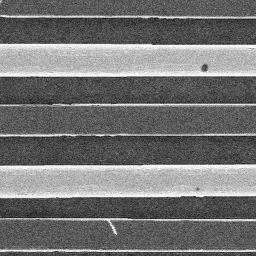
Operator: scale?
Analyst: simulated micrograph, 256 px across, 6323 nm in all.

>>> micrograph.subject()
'lines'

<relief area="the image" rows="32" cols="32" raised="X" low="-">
XXXXXXXXXXXXXXXXXXXXXXXXXXXXXXXX
XXXXXXXXXXXXXXXXXXXXXXXXXXXXXXXX
--------------------------------
--------------------------------
--------------------------------
--------------------------------
XXXXXXXXXXXXXXXXXXXXXXXXXXXXXXXX
XXXXXXXXXXXXXXXXXXXXXXXXXXXXXXXX
XXXXXXXXXXXXXXXXXXXXXXXXXXXXXXXX
--------------------------------
--------------------------------
--------------------------------
--------------------------------
XXXXXXXXXXXXXXXXXXXXXXXXXXXXXXXX
XXXXXXXXXXXXXXXXXXXXXXXXXXXXXXXX
XXXXXXXXXXXXXXXXXXXXXXXXXXXXXXXX
XXXXXXXXXXXXXXXXXXXXXXXXXXXXXXXX
--------------------------------
--------------------------------
--------------------------------
--------------------------------
XXXXXXXXXXXXXXXXXXXXXXXXXXXXXXXX
XXXXXXXXXXXXXXXXXXXXXXXXXXXXXXXX
XXXXXXXXXXXXXXXXXXXXXXXXXXXXXXXX
XXXXXX--------------------------
--------------------------------
--------------------------------
XXXXXXXXXXXXXXXXXXXXXXXXXXXXXXXX
XXXXXXXXXXXXXXXXXXXXXXXXXXXXXXXX
XXXXXXXXXXXXXXXXXXXXXXXXXXXXXXXX
XXXXXXXXXXXXXXXXXXXXXXXXXXXXXXXX
--------------------------------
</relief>